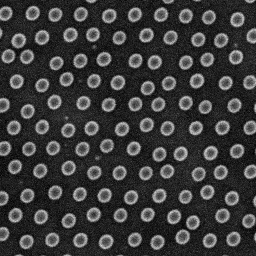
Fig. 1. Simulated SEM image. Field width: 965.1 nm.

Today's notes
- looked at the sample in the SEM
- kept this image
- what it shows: a regular array of raised bodies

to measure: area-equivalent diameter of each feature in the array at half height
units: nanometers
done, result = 48.2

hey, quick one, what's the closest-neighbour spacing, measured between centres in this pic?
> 0.0854 microns